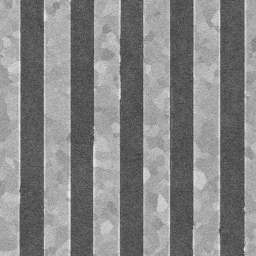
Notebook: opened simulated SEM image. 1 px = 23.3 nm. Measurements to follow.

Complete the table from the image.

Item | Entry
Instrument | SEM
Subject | lines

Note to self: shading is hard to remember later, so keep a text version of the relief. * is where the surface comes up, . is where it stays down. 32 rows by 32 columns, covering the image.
**....***...***...***...***....*
**....***...***...***...***....*
**....***...***...***...***....*
**....***...***...***...***....*
**....***...***...***...***....*
**....***...***...***...***....*
**....***...***...***...***....*
**....***...***...***...***....*
**....***...***...***...***....*
**....***...***...***...***....*
**....***...***...***...***....*
**....***...***...***...***....*
**....***...***...***...***....*
**....***...***...***...***....*
**....***...***...***...***....*
**....***...***...***...***....*
**....***...***...***...***....*
**....***...***...***...***....*
**....***...***...***...***....*
**....***...***...***...***....*
**....***...***...***...***....*
**....***...***...***...***....*
**....***...***...***...***....*
**....***...***...***...***....*
**....***...***...***...***....*
**....***...***...***...***....*
**....***...***...***...***....*
**....***...***...***...***....*
**....***...***...***...***....*
**....***...***...***...***....*
**....***...***...***...***....*
**....***...***...***...***....*